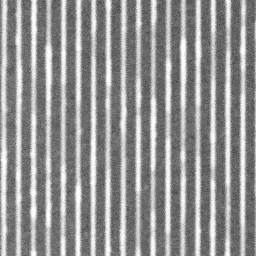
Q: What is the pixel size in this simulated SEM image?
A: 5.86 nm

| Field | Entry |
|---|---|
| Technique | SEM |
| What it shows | parallel lines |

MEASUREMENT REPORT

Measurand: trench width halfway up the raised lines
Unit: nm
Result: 71.7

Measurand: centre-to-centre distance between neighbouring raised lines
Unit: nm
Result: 87.4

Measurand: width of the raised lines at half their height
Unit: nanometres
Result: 15.4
